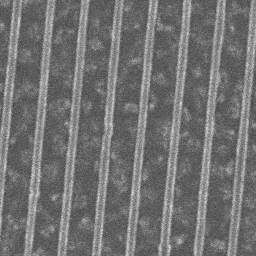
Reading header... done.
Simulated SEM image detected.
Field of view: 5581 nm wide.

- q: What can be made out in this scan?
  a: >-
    parallel lines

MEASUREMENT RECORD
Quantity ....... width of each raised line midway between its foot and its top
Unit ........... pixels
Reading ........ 7.59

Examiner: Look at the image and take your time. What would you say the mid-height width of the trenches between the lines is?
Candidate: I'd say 578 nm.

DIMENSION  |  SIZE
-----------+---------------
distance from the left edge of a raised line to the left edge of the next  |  739 nanometers